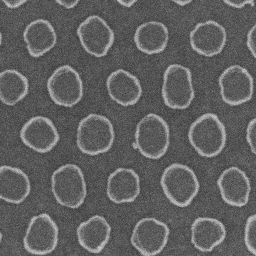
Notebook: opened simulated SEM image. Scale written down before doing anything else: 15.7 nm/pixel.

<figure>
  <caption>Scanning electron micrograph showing a regular array of raised bodies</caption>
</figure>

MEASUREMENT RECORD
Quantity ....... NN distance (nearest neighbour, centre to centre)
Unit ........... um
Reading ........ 0.856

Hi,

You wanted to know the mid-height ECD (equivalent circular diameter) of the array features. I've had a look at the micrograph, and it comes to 0.545 µm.